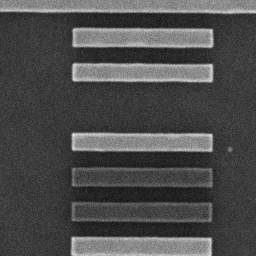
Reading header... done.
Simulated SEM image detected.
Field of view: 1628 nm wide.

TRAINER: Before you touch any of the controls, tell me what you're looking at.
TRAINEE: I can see wiring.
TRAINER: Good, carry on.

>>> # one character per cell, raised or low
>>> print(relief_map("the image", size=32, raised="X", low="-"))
XXXXXXXXXXXXXXXXXXXXXXXXXXXXXXXX
-------------XXXXXXXXXXXXXXXXXXX
--------------------------------
--------------------------------
---------XXXXXXXXXXXXXXXXXX-----
---------XXXXXXXXXXXXXXXXXX-----
--------------------------------
--------------------------------
---------XXXXXXXXXXXXXXXXX------
---------XXXXXXXXXXXXXXXXX------
--------------------------------
--------------------------------
--------------------------------
--------------------------------
--------------------------------
--------------------------------
--------------------------------
---------XXXXXXXXXXXXXXXXX------
---------XXXXXXXXXXXXXXXXX------
--------------------------------
--------------------------------
---------XXXXXXXXXXXXXXXXX------
---------XXXXXXXXXXXXXXXXX------
--------------------------------
--------------------------------
---------XXXXXXXXXXXXXXXXX------
---------XXXXXXXXXXXXXXXXX------
---------XXXXXXXXXXXXXXXXX------
--------------------------------
--------------------------------
---------XXXXXXXXXXXXXXXXX------
---------XXXXXXXXXXXXXXXXX------